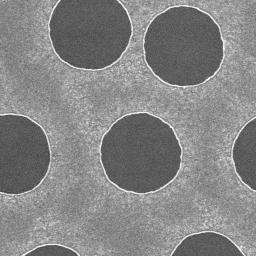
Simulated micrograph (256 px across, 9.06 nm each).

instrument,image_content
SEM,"holes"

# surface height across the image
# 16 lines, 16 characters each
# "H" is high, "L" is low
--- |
HHHLLLLLHHHLHHHH
HHHLLLLLHLLLLLHH
HHHLLLLLHLLLLLHH
HHHHLLLLHLLLLLHH
HHHHHHHHHHLLLHHH
HHHHHHHHHHHHHHHH
HHHHHHHHHHHHHHHH
LLHHHHHLLLHHHHHH
LLLHHHHLLLLHHHHL
LLLHHHLLLLLHHHHL
LLLHHHLLLLLHHHHL
LLHHHHHLLLHHHHHL
HHHHHHHHHHHHHHHH
HHHHHHHHHHHHHHHH
HHHHHHHHHHHHHHHH
HHLLHHHHHHHLLLLH